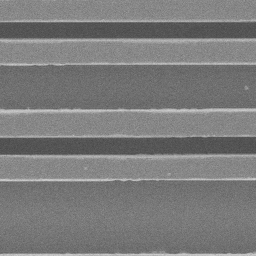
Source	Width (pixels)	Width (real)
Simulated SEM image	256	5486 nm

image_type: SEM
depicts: lines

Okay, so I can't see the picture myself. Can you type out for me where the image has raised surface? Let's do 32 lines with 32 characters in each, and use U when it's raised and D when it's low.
UUUUUUUUUUUUUUUUUUUUUUUUUUUUUUUU
UUUUUUUUUUUUUUUUUUUUUUUUUUUUUUUU
UUUUUUUUUUUUUUUUUUUUUUUUUUUUUUUU
DDDDDDDDDDDDDDDDDDDDDDDDDDDDDDDD
DDDDDDDDDDDDDDDDDDDDDDDDDDDDDDDD
UUUUUUUUUUUUUUUUUUUUUUUUUUUUUUUU
UUUUUUUUUUUUUUUUUUUUUUUUUUUUUUUU
UUUUUUUUUUUUUUUUUUUUUUUUUUUUUUUU
DDDDDDDDDDDDDDDDDDDDDDDDDDDDDDDD
DDDDDDDDDDDDDDDDDDDDDDDDDDDDDDDD
DDDDDDDDDDDDDDDDDDDDDDDDDDDDDDDD
DDDDDDDDDDDDDDDDDDDDDDDDDDDDDDDD
DDDDDDDDDDDDDDDDDDDDDDDDDDDDDDDD
DDDDDDDDDDDDDDDDDDDDDDDDDDDDDDDD
UUUUUUUUUUUUUUUUUUUUUUUUUUUUUUUU
UUUUUUUUUUUUUUUUUUUUUUUUUUUUUUUU
UUUUUUUUUUUUUUUUUUUUUUUUUUUUUUUU
DDDDDDDDDDDDDDDDDDDDDDDDDDDDDDDD
DDDDDDDDDDDDDDDDDDDDDDDDDDDDDDDD
UUUUUUUUUUUUUUUUUUUUUUUUUUUUUUUU
UUUUUUUUUUUUUUUUUUUUUUUUUUUUUUUU
UUUUUUUUUUUUUUUUUUUUUUUUUUUUUUUU
UUUUUUUUUUUUUUDUUUDDDDDDDDDDDDDD
DDDDDDDDDDDDDDDDDDDDDDDDDDDDDDDD
DDDDDDDDDDDDDDDDDDDDDDDDDDDDDDDD
DDDDDDDDDDDDDDDDDDDDDDDDDDDDDDDD
DDDDDDDDDDDDDDDDDDDDDDDDDDDDDDDD
DDDDDDDDDDDDDDDDDDDDDDDDDDDDDDDD
DDDDDDDDDDDDDDDDDDDDDDDDDDDDDDDD
DDDDDDDDDDDDDDDDDDDDDDDDDDDDDDDD
DDDDDDDDDDDDDDDDDDDDDDDDDDDDDDDD
DDDDDDDDDDDDDDDDDDDDDDDDDDDDDDDD